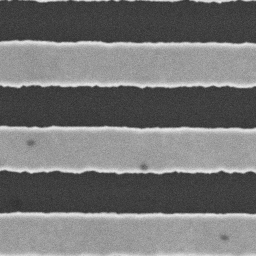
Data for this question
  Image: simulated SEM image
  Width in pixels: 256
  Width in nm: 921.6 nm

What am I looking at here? lines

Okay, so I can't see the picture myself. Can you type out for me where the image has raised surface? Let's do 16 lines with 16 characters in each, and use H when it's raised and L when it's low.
LLLLLLLLLLLLLLLL
LLLLLLLLLLLLLLLL
LLLLLLLLLLLLLLLL
HHHHHHHHHHHHHHHH
HHHHHHHHHHHHHHHH
LLLLLLLLLLLLLLLL
LLLLLLLLLLLLLLLL
LLLLLLLLLLLLLLLL
HHHHHHHHHHHHHHHH
HHHHHHHHHHHHHHHH
HHHHHHHHHHHHHHHH
LLLLLLLLLLLLLLLL
LLLLLLLLLLLLLLLL
HHHHHHHHHHHHHHHH
HHHHHHHHHHHHHHHH
HHHHHHHHHHHHHHHH